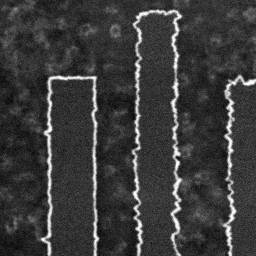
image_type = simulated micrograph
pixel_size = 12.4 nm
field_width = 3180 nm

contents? one or a few lines or trenches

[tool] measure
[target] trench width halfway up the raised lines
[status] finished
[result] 592 nm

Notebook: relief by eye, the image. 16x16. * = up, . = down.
................
.........**.....
.........**.....
.........**.....
.........**.....
...***...**...**
...***...**...**
...***...**...**
...***...**...**
...***..***...**
...***..***...**
...***...**...**
...***...**...**
...***...**...**
...***...**...**
...***...**...**